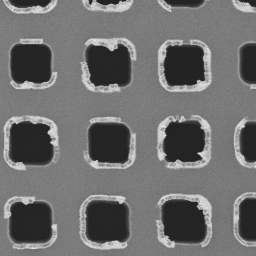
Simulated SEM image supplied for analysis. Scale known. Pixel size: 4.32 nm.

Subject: a regular array of holes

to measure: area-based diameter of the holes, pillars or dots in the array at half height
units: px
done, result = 45.1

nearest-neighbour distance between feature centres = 0.329 micrometres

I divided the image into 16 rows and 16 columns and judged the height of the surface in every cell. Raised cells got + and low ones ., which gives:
++++++++++++++++
++++++++++++++++
++++++++++++++++
+..++...++...++.
+..+++..++...++.
++++++++++++++++
++++++++++++++++
++++++++++++++++
+..+++..++...++.
+..+++..++...++.
++++++++++++++++
++++++++++++++++
+++++++++++++++.
+..++...++...++.
+..++...++...++.
++++++++++++++++